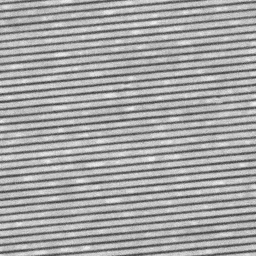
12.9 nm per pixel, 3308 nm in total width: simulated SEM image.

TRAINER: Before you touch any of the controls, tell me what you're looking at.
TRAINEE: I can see parallel lines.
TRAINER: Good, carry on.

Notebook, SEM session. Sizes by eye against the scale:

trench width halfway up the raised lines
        0.0434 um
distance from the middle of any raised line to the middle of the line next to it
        97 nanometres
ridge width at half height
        0.0547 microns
